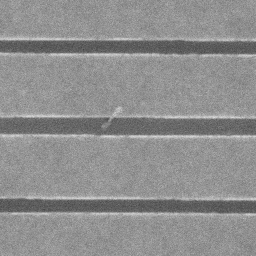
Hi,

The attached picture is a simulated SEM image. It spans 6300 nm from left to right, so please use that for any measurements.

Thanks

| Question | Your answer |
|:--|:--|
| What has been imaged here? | lines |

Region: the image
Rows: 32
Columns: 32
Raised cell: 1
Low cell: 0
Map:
11111111111111111111111111111111
11111111111111111111111111111111
11111111111111111111111111111111
11111111111111111111111111111111
11111111111111111111111111111111
00000000000000000000000000000000
00000000000000000000000000000000
11111111111111111111111111111111
11111111111111111111111111111111
11111111111111111111111111111111
11111111111111111111111111111111
11111111111111111111111111111111
11111111111111111111111111111111
11111111111111111111111111111111
11111111111111111111111111111111
00000000000000000000000000000000
00000000000000000000000000000000
11111111111111111111111111111111
11111111111111111111111111111111
11111111111111111111111111111111
11111111111111111111111111111111
11111111111111111111111111111111
11111111111111111111111111111111
11111111111111111111111111111111
11111111111111111111111111111111
00000000000000000000000000000000
00000000000000000000000000000000
11111111111111111111111111111111
11111111111111111111111111111111
11111111111111111111111111111111
11111111111111111111111111111111
11111111111111111111111111111111